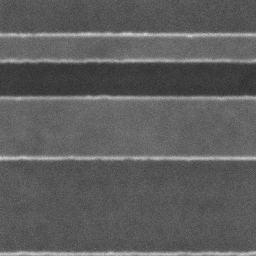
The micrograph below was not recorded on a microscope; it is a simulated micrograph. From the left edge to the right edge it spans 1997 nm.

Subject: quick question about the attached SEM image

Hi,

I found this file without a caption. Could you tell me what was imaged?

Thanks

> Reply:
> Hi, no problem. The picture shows lines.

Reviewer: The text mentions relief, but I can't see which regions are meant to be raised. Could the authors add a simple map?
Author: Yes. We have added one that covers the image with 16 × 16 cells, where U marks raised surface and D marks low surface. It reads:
DDDDDDDDDDDDDDDD
DDDDDDDDDDDDDDDD
UUUUUUUUUUUUUUUU
UUUUUUUUUUUUUUUU
DDDDDDDDDDDDDDDD
DDDDDDDDDDDDDDDD
UUUUUUUUUUUUUUUU
UUUUUUUUUUUUUUUU
UUUUUUUUUUUUUUUU
UUUUUUUUUUUUUUUU
DDDDDDDDDDDDDDDD
DDDDDDDDDDDDDDDD
DDDDDDDDDDDDDDDD
DDDDDDDDDDDDDDDD
DDDDDDDDDDDDDDDD
DDDDDDDDDDDDDDDD